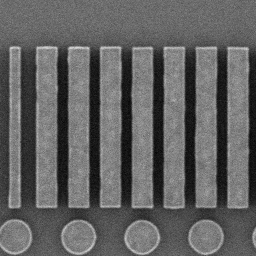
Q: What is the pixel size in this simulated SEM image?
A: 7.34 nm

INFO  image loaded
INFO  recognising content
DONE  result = groups of lines, slits or small figures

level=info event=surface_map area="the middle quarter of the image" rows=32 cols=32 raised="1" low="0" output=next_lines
01111100011111000111110001111100
01111100011111000111110001111100
01111100011111000111110001111100
01111100011111000111110001111100
01111100011111000111110001111100
01111100011111000111110001111100
01111100011111000111110001111100
01111100011111000111110001111100
01111100011111000111110001111100
01111100011111000111110001111100
01111100011111000111110001111100
01111100011111000111110001111100
01111100011111000111110001111100
01111100011111000111110001111100
01111100011111000111110001111100
01111100011111000111110001111100
01111100011111000111110001111100
01111100011111000111110001111100
01111100011111000111110001111100
01111100011111000111110001111100
01111100011111000111110001111100
01111100011111000111110001111100
01111100011111000111110001111100
01111100011111000111110001111100
01111100011111000111110001111100
01111100011111000111110001111100
01111100011111000111110001111100
01111100011111000111110001111100
01111100011111000111110001111100
01111100011111000111110001111100
01111100011111000111110001111100
01111100011111000111110001111100